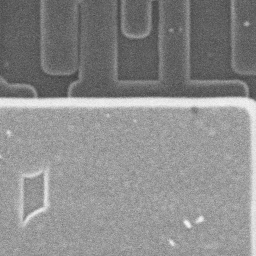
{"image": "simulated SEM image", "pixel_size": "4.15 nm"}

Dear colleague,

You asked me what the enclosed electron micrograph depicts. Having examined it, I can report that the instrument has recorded wiring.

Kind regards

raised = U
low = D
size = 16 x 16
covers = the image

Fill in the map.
DDDDDDDDDDDDDDDD
DDDDDDDDDDDDDDDD
DDDDDDDDDDDDDDDD
DDDDDDDDDDDDDDDD
DDDDDDDDDDDDDDDD
DDDDDDDDDDDDDDDD
UUUUUUUUUUUUUUUU
UUUUUUUUUUUUUUUU
UUUUUUUUUUUUUUUU
UUUUUUUUUUUUUUUU
UUUUUUUUUUUUUUUU
UUUUUUUUUUUUUUUU
UUUUUUUUUUUUUUUU
UUUUUUUUUUUUUUUU
UUUUUUUUUUUUUUUU
UUUUUUUUUUUUUUUU